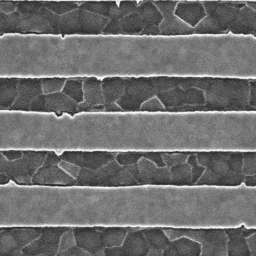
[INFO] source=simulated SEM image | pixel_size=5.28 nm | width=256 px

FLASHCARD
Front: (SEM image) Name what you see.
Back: one or a few lines or trenches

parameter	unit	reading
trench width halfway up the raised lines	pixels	35.5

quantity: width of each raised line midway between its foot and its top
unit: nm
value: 213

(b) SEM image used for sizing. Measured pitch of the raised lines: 397 nm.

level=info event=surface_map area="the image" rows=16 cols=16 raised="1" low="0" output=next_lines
0000000000000000
0000000000000000
1111111111111111
1111111111111111
1111111111111111
0000000000000000
0000000000000000
1111111111111111
1111111111111111
0001000000000000
0000000000000000
1001000000000000
1111111111111111
1111111111111111
0000000000000000
0000000000000000